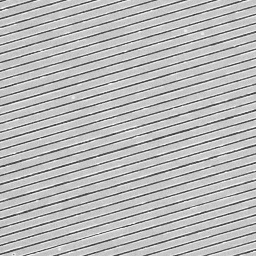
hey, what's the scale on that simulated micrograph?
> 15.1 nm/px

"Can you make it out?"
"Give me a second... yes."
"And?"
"parallel lines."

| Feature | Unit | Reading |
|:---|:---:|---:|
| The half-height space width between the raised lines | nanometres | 28.9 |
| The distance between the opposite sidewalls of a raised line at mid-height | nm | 94.1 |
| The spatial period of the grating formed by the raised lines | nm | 126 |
